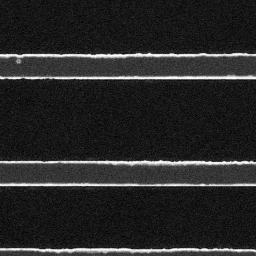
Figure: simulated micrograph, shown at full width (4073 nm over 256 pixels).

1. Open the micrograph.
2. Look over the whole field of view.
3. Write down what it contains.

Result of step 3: lines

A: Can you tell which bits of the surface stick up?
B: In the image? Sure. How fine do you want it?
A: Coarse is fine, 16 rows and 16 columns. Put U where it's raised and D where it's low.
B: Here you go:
DDDDDDDDDDDDDDDD
DDDDDDDDDDDDDDDD
DDDDDDDDDDDDDDDD
UUUUUUUUUUUUUUUU
UUUUUUUUUUUUUUUU
DDDDDDDDDDDDDDDD
DDDDDDDDDDDDDDDD
DDDDDDDDDDDDDDDD
DDDDDDDDDDDDDDDD
DDDDDDDDDDDDDDDD
UUUUUUUUUUUUUUUU
UUUUUUUUUUUUUUUU
DDDDDDDDDDDDDDDD
DDDDDDDDDDDDDDDD
DDDDDDDDDDDDDDDD
DDDDDDDDDDDDDDDD